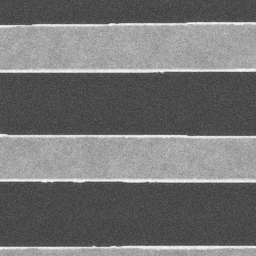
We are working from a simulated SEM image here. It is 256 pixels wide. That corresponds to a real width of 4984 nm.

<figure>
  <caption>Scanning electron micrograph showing lines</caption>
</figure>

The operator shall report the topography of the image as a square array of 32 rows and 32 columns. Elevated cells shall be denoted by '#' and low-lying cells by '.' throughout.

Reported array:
................................
................................
................................
################################
################################
################################
################################
################################
################################
................................
................................
................................
................................
................................
................................
................................
................................
################################
################################
################################
################################
################################
################################
................................
................................
................................
................................
................................
................................
................................
................................
################################